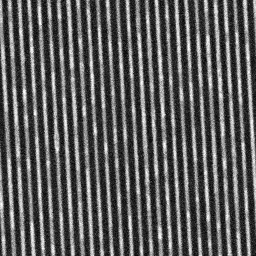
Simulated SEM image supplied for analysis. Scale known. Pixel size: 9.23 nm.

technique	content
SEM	parallel lines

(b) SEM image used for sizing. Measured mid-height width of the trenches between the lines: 66.8 nanometres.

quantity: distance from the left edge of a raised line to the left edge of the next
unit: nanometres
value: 90.3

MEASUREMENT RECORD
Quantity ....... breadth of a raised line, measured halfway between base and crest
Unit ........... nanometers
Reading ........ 25.3